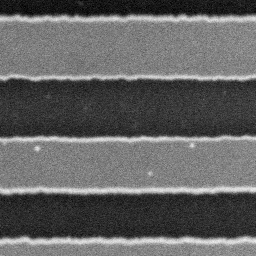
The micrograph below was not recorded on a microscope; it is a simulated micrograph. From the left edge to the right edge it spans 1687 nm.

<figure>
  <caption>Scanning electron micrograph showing lines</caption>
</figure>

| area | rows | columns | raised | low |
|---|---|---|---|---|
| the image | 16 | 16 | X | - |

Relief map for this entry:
----------------
XXXXXXXXXXXXXXXX
XXXXXXXXXXXXXXXX
XXXXXXXXXXXXXXXX
XXXXXXXXXXXXXXXX
----------------
----------------
----------------
----------------
XXXXXXXXXXXXXXXX
XXXXXXXXXXXXXXXX
XXXXXXXXXXXXXXXX
----------------
----------------
----------------
XXXXXXXXXXXXXXXX